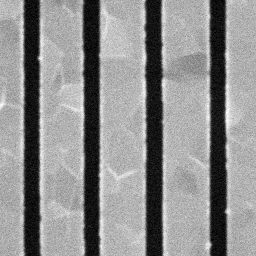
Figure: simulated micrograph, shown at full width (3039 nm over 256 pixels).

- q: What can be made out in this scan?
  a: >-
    lines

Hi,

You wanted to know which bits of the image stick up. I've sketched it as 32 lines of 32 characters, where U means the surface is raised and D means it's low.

UUUDDUUUUUDDDUUUUUDDUUUUUUDDUUUU
UUUDDUUUUUDDDUUUUUDDUUUUUUDDUUUU
UUUDDUUUUUDDDUUUUUDDUUUUUUDDUUUU
UUUDDUUUUUDDDUUUUUDDUUUUUUDDUUUU
UUUDDUUUUUDDDUUUUUDDUUUUUUDDUUUU
UUUDDUUUUUDDDUUUUUDDUUUUUUDDUUUU
UUUDDUUUUUDDDUUUUUDDUUUUUUDDUUUU
UUUDDUUUUUDDDUUUUUDDUUUUUUDDUUUU
UUUDDUUUUUDDDUUUUUDDUUUUUUDDUUUU
UUUDDUUUUUDDDUUUUUDDUUUUUUDDUUUU
UUUDDUUUUUDDDUUUUUDDUUUUUUDDUUUU
UUUDDUUUUUDDDUUUUUDDUUUUUUDDUUUU
UUUDDUUUUUDDDUUUUUDDUUUUUUDDUUUU
UUUDDUUUUUDDDUUUUUDDUUUUUUDDUUUU
UUUDDUUUUUDDDUUUUUDDUUUUUUDDUUUU
UUUDDUUUUUDDDUUUUUDDUUUUUUDDUUUU
UUUDDUUUUUDDDUUUUUDDUUUUUUDDUUUU
UUUDDUUUUUDDDUUUUUDDUUUUUUDDUUUU
UUUDDUUUUUDDDUUUUUDDUUUUUUDDUUUU
UUUDDUUUUUDDDUUUUUDDUUUUUUDDUUUU
UUUDDUUUUUDDDUUUUUDDUUUUUUDDUUUU
UUUDDUUUUUDDUUUUUUDDUUUUUUDDUUUU
UUUDDUUUUUDDDUUUUUDDUUUUUUDDUUUU
UUUDDUUUUUDDDUUUUUDDUUUUUUDDUUUU
UUUDDUUUUUDDDUUUUUDDUUUUUUDDUUUU
UUUDDUUUUUDDDUUUUUDDUUUUUUDDUUUU
UUUDDUUUUUDDDUUUUUDDUUUUUUDDUUUU
UUUDDUUUUUDDDUUUUUDDUUUUUUDDUUUU
UUUDDUUUUUDDDUUUUUDDUUUUUUDDUUUU
UUUDDUUUUUDDDUUUUUDDUUUUUUDDUUUU
UUUDDUUUUUDDDUUUUUDDUUUUUUDDUUUU
UUUDDUUUUUDDDUUUUUDDUUUUUUDDUUUU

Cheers